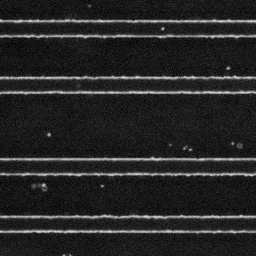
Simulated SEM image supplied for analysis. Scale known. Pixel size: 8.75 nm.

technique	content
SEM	lines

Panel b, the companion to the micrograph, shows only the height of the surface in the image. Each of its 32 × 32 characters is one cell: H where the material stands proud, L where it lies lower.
LLLLLLLLLLLLLLLLLLLLLLLLLLLLLLLL
LLLLLLLLLLLLLLLLLLLLLLLLLLLLLLLL
LLLLLLLLLLLLLLLLLLLLLLLLLLLLLLLL
HHHHHHHHHHHHHHHHHHHHHHHHHHHHHHHH
HHHHHHHHHHHHHHHHHHHHHHHHHHHHHHHH
LLLLLLLLLLLLLLLLLLLLLLLLLLLLLLLL
LLLLLLLLLLLLLLLLLLLLLLLLLLLLLLLL
LLLLLLLLLLLLLLLLLLLLLLLLLLLLLLLL
LLLLLLLLLLLLLLLLLLLLLLLLLLLLLLLL
LLLLLLLLLLLLLLLLLLLLLLLLLLLLLLLL
HHHHHHHHHHHHHHHHHHHHHHHHHHHHHHHH
HHHHHHHHHHHHHHHHHHHHHHHHHHHHHHHH
LLLLLLLLLLLLLLLLLLLLLLLLLLLLLLLL
LLLLLLLLLLLLLLLLLLLLLLLLLLLLLLLL
LLLLLLLLLLLLLLLLLLLLLLLLLLLLLLLL
LLLLLLLLLLLLLLLLLLLLLLLLLLLLLLLL
LLLLLLLLLLLLLLLLLLLLLLLLLLLLLLLL
LLLLLLLLLLLLLLLLLLLLLLLLLLLLLLLL
LLLLLLLLLLLLLLLLLLLLLLLLLLLLLLLL
LLLLLLLLLLLLLLLLLLLLLLLLLLLLLLLL
HHHHHHHHHHHHHHHHHHHHHHHHHHHHHHHH
HHHHHHHHHHHHHHHHHHHHHHHHHHHHHHHH
LLLLLLLLLLLLLLLLLLLLLLLLLLLLLLLL
LLLLLLLLLLLLLLLLLLLLLLLLLLLLLLLL
LLLLLLLLLLLLLLLLLLLLLLLLLLLLLLLL
LLLLLLLLLLLLLLLLLLLLLLLLLLLLLLLL
LLLLLLLLLLLLLLLLLLLLLLLLLLLLLLLL
HHHHHHHHHHHHHHHHHHHHHHHHHHHHHHHH
HHHHHHHHHHHHHHHHHHHHHHHHHHHHHHHH
LLLLLLLLLLLLLLLLLLLLLLLLLLLLLLLL
LLLLLLLLLLLLLLLLLLLLLLLLLLLLLLLL
LLLLLLLLLLLLLLLLLLLLLLLLLLLLLLLL